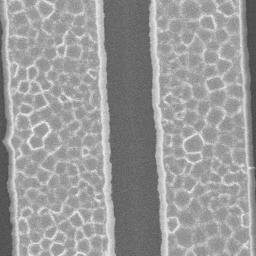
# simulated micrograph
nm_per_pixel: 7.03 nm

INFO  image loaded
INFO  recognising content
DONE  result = one or a few lines or trenches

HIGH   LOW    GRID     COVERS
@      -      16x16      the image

@@@@@@----@@@@@-
@@@@@@----@@@@@-
@@@@@@----@@@@@-
@@@@@@----@@@@@-
@@@@@@----@@@@@-
@@@@@@----@@@@@-
-@@@@@----@@@@@-
-@@@@@@---@@@@@-
@@@@@@@---@@@@@@
-@@@@@@---@@@@@@
-@@@@@@---@@@@@@
-@@@@@@---@@@@@@
-@@@@@@---@@@@@@
-@@@@@@---@@@@@@
-@@@@@@---@@@@@@
-@@@@@@---@@@@@@